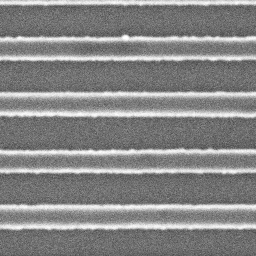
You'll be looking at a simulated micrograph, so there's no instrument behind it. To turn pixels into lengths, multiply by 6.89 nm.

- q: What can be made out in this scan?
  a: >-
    lines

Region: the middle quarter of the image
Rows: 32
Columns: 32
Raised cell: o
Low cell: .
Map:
................................
................................
................................
................................
................................
................................
................................
oooooooooooooooooooooooooooooooo
oooooooooooooooooooooooooooooooo
oooooooooooooooooooooooooooooooo
oooooooooooooooooooooooooooooooo
oooooooooooooooooooooooooooooooo
oooooooooooooooooooooooooooooooo
................................
................................
................................
................................
................................
................................
................................
................................
.............................o..
oooooooooooooooooooooooooooooooo
oooooooooooooooooooooooooooooooo
oooooooooooooooooooooooooooooooo
oooooooooooooooooooooooooooooooo
oooooooooooooooooooooooooooooooo
................................
................................
................................
................................
................................